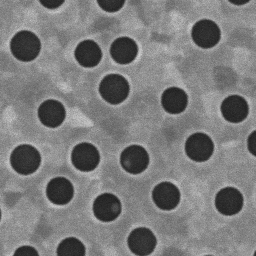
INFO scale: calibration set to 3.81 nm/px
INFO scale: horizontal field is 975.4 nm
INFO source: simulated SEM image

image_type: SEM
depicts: a regular array of holes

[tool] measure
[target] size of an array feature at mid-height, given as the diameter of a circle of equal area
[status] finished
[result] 112 nm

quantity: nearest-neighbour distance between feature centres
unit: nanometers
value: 188